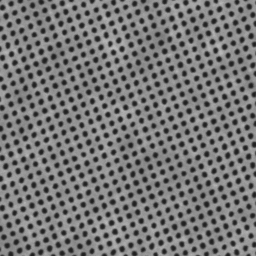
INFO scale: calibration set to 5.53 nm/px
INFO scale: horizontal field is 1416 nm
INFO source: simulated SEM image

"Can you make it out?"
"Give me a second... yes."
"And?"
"a regular array of holes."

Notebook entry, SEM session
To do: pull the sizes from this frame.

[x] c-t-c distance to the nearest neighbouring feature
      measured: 0.05 microns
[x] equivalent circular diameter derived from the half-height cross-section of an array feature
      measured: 5.64 pixels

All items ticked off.